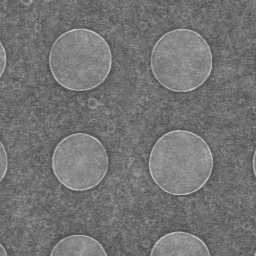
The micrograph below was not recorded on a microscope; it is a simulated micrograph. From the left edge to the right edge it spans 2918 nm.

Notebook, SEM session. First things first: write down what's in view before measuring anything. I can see raised bodies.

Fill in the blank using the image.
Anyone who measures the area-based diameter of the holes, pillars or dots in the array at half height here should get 0.703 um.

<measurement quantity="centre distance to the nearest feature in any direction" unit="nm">1150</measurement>